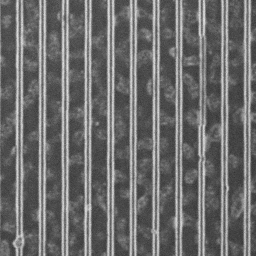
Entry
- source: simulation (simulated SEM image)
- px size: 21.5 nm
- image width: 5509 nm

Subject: parallel lines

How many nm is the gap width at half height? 395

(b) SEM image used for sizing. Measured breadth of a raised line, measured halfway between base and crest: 94.1 nanometres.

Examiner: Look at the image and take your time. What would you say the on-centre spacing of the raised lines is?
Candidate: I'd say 490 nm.